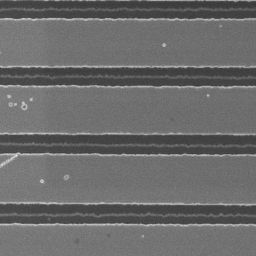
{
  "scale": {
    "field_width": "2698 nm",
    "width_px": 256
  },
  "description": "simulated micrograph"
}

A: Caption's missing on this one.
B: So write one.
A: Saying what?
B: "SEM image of lines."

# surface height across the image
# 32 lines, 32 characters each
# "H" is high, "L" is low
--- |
LLLLLLLLLLLLLLLLLLLLLLLLLLLLLLLL
LLLLLLLLLLLLLLLLLLLLLLLLLLLLLLLL
HHHHHHHHHHHHHHHHHHHHHHHHHHHHHHHH
HHHHHHHHHHHHHHHHHHHHHHHHHHHHHHHH
HHHHHHHHHHHHHHHHHHHHHHHHHHHHHHHH
HHHHHHHHHHHHHHHHHHHHHHHHHHHHHHHH
HHHHHHHHHHHHHHHHHHHHHHHHHHHHHHHH
HHHHHHHHHHHHHHHHHHHHHHHHHHHHHHHH
LLLLLLLLLLLLLLLLLLLLLLLLLLLLLLLL
LLLLLLLLLLLLLLLLLLLLLLLLLLLLLLLL
LLLLLLLLLLLLLLLLLLLLLLLLLLLLLLLL
HHHHHHHHHHHHHHHHHHHHHHHHHHHHHHHH
HHHHHHHHHHHHHHHHHHHHHHHHHHHHHHHH
HHHHHHHHHHHHHHHHHHHHHHHHHHHHHHHH
HHHHHHHHHHHHHHHHHHHHHHHHHHHHHHHH
HHHHHHHHHHHHHHHHHHHHHHHHHHHHHHHH
HHHHHHHHHHHHHHHHHHHHHHHHHHHHHHHH
LLLLLLLLLLLLLLLLLLLLLLLLLLLLLLLL
LLLLLLLLLLLLLLLLLLLLLLLLLLLLLLLL
HHHHHHHHHHHHHHHHHHHHHHHHHHHHHHHH
HHHHHHHHHHHHHHHHHHHHHHHHHHHHHHHH
HHHHHHHHHHHHHHHHHHHHHHHHHHHHHHHH
HHHHHHHHHHHHHHHHHHHHHHHHHHHHHHHH
HHHHHHHHHHHHHHHHHHHHHHHHHHHHHHHH
HHHHHHHHHHHHHHHHHHHHHHHHHHHHHHHH
LLLLLHHHLLHHHLLHHHHHHHHHHHHHHHHH
LLLLLLLLLLLLLLLLLLLLLLLLLLLLLLLL
LLLLLLLLLLLLLLLLLLLLLLLLLLLLLLLL
HHHHHHHHHHHHHHHHHHHHHHHHHHHHHHHH
HHHHHHHHHHHHHHHHHHHHHHHHHHHHHHHH
HHHHHHHHHHHHHHHHHHHHHHHHHHHHHHHH
HHHHHHHHHHHHHHHHHHHHHHHHHHHHHHHH